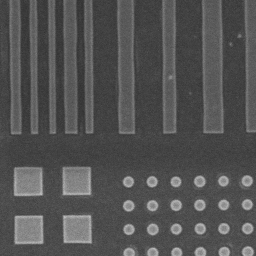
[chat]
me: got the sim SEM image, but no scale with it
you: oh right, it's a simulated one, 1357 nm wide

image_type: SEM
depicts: groups of lines, slits or small figures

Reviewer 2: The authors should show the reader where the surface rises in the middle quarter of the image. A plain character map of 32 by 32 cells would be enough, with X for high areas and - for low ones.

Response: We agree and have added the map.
XXX--XX-------XXX--------XXX----
XXX--XX-------XXX--------XXX----
XXX--XX-------XXX--------XXX----
XXX--XX-------XXX--------XXX----
XXX--XX-------XXX--------XXX----
XXX--XX-------XXX--------XXX----
XXX--XX-------XXX--------XXX----
XXX--XX-------XXX--------XXX----
XXX--XX-------XXX--------XXX----
XXX--XX-------XXX--------XXX----
XXX--XX-------XXX--------XXX----
XXX--XX-------XXX--------XXX----
XXX--XX-------XXX--------XXX----
XXX--XX-------XXX--------XXX----
XXX--XX-------XXX--------XXX----
XXX--XX-------XXX--------XXX----
XXX--XX-------XXX--------XXX----
--------------------------------
--------------------------------
--------------------------------
--------------------------------
--------------------------------
--------------------------------
--------------------------------
--------------------------------
--------------------------------
XXXXXXX-------------------------
XXXXXXX-------------------------
XXXXXXX--------XX----XX----XX---
XXXXXXX--------XX----XX----XX---
XXXXXXX--------XX----XX----XX---
XXXXXXX-------------------------